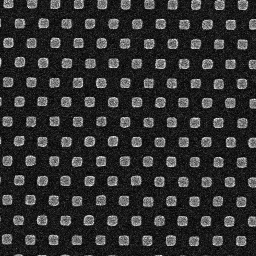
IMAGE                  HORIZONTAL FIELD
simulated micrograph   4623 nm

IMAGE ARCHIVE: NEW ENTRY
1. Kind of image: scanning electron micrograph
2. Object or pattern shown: a regular array of raised bodies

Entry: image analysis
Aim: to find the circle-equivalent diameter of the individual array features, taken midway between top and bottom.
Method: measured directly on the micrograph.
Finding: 192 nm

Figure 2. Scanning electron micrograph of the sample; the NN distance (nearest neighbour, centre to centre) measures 22.5 px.